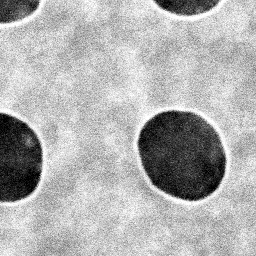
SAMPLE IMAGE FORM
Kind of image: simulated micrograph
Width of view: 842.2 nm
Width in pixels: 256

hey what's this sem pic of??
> holes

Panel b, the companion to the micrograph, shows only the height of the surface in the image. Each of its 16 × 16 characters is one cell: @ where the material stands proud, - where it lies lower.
--@@@@@@@@---@@@
@@@@@@@@@@@@@@@@
@@@@@@@@@@@@@@@@
@@@@@@@@@@@@@@@@
@@@@@@@@@@@@@@@@
@@@@@@@@@@@@@@@@
@@@@@@@@@@@@@@@@
-@@@@@@@@----@@@
--@@@@@@@-----@@
---@@@@@@-----@@
---@@@@@@-----@@
--@@@@@@@@----@@
-@@@@@@@@@@--@@@
@@@@@@@@@@@@@@@@
@@@@@@@@@@@@@@@@
@@@@@@@@@@@@@@@@